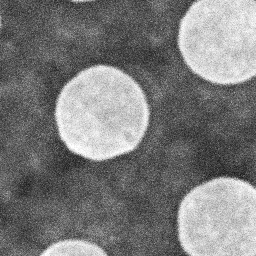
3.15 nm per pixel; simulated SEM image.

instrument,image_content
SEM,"raised bodies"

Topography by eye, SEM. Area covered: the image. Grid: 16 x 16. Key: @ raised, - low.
------------@@@@
-----------@@@@@
-----------@@@@@
-----------@@@@@
-----@@-----@@@@
----@@@@@-------
----@@@@@-------
----@@@@@-------
----@@@@@-------
-----@@@--------
----------------
-------------@@-
------------@@@@
-----------@@@@@
-----------@@@@@
---@@@------@@@@